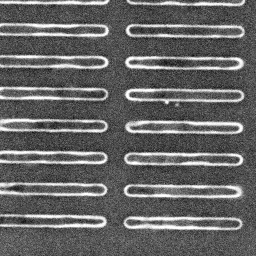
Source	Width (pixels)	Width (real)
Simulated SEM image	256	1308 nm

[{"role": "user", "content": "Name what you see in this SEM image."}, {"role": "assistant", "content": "groups of lines, slits or small figures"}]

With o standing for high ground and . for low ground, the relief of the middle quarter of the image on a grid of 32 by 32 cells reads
oooooooooo......oooooooooooooooo
................................
................................
................................
................................
................................
oooooooooo.............oooooo...
ooooooooooo.....oooooooooooooooo
oooooooooo......oooooooooooooooo
................................
................................
................................
................................
................................
oooooooooo......................
ooooooooooo.....oooooooooooooooo
oooooooooo......oooooooooooooooo
................................
................................
................................
................................
................................
oooooooooo......oo..............
oooooooooo.....ooooooooooooooooo
oooooooooo......oooooooooooooooo
................................
................................
................................
................................
................................
oooooooooo......ooo.............
oooooooooo.....ooooooooooooooooo